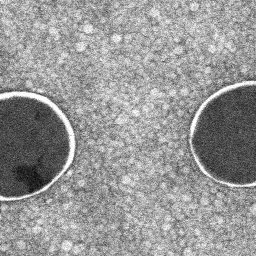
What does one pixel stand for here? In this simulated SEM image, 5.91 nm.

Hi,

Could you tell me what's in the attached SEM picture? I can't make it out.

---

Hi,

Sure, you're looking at raised bodies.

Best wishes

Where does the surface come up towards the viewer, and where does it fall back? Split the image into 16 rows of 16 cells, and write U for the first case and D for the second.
DDDDDDDDDDDDDDDD
DDDDDDDDDDDDDDDD
DDDDDDDDDDDDDDDD
DDDDDDDDDDDDDDDD
DDDDDDDDDDDDDDDD
DDDDDDDDDDDDDDUU
UUUDDDDDDDDDDUUU
UUUUDDDDDDDDUUUU
UUUUDDDDDDDDUUUU
UUUUUDDDDDDDUUUU
UUUUDDDDDDDDDUUU
UUUDDDDDDDDDDDUU
DDDDDDDDDDDDDDDD
DDDDDDDDDDDDDDDD
DDDDDDDDDDDDDDDD
DDDDDDDDDDDDDDDD